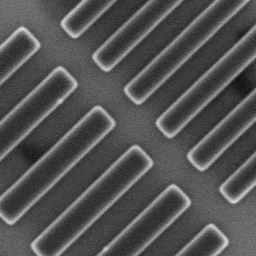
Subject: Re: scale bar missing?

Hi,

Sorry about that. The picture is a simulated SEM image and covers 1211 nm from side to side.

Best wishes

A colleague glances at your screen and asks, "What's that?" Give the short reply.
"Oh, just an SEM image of groups of lines, slits or small figures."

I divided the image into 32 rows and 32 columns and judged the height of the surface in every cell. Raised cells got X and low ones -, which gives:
----------XXXX----XXXX-----XXXX-
---------XXXX----XXXX----XXXX---
--------XXXX----XXXX----XXXX----
--------XXX----XXXX----XXXX-----
-XXX-----X----XXXX----XXXX-----X
XXXXX--------XXXX----XXXX-----XX
XXXX--------XXXX----XXXX-----XXX
XXX---------XXX----XXXX----XXXXX
XX-----------X----XXXX----XXXX--
X-----XXX--------XXXX----XXXX---
-----XXXX-------XXXX----XXXX----
----XXXXX-------XXX----XXXX-----
---XXXXX---------X----XXXX----XX
--XXXXX--------------XXXX----XXX
-XXXXX-----XXX------XXXX----XXXX
XXXXX-----XXXX------XXX----XXXX-
XXXX-----XXXX-------XX----XXXX--
XXX-----XXXX-------------XXXX---
X-----XXXXX-----X-------XXXX----
X-----XXXX-----XXX------XXX-----
----XXXXX-----XXXXX-----XX-----X
---XXXXX-----XXXXX-----------XXX
--XXXXX-----XXXXX-----------XXXX
-XXXXX-----XXXXX-----X------XXX-
XXXXX-----XXXXX-----XXX-----XX--
XXXX-----XXXXX-----XXXXX--------
XXX-----XXXXX-----XXXXX---------
-X-----XXXXX-----XXXXX----------
------XXXXX-----XXXXX-----X-----
-----XXXXX-----XXXXX-----XXX----
----XXXXX-----XXXXX-----XXXX----
----XXXX-----XXXX-----XXXXX-----